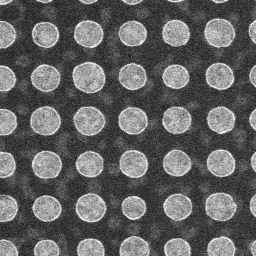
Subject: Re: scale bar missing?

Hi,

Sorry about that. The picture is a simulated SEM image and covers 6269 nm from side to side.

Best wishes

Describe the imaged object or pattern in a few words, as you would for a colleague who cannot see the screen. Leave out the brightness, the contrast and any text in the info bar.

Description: a regular array of raised bodies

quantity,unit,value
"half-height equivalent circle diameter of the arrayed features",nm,655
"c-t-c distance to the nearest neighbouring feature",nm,1060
